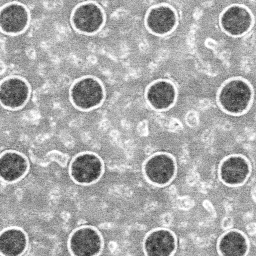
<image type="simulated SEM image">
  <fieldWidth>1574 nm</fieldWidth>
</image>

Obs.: a regular array of raised bodies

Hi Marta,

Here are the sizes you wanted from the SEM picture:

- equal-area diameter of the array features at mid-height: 203 nanometers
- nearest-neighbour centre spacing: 455 nanometres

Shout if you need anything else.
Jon